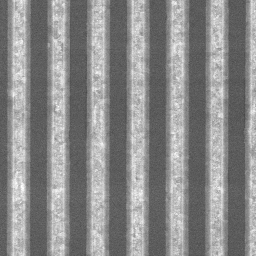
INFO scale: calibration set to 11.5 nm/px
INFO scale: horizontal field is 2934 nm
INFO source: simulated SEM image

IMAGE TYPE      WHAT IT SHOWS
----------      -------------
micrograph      parallel lines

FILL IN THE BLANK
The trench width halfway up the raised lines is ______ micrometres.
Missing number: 0.272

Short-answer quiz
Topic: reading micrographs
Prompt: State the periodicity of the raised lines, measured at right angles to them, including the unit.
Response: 454 nm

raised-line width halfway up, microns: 0.175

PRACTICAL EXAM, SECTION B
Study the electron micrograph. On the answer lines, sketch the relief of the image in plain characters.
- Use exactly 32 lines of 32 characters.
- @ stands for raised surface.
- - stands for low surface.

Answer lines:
--@---@@---@@---@@---@@---@@---@
--@---@@---@@---@@---@@---@@---@
-@@---@@---@@---@@---@@---@@---@
-@@---@@---@@---@@---@@---@@---@
-@@---@@---@@---@@---@@---@@---@
-@@---@@---@@---@@---@@---@@---@
-@@---@@---@@---@@---@@---@@---@
-@@---@@---@@---@@---@@---@@---@
-@@---@@---@@---@@---@@---@@---@
-@@---@@---@@---@@---@@---@@---@
-@@---@@---@@---@@---@@---@@---@
-@@---@@---@@---@@---@@---@@---@
-@@---@@---@@---@@---@@---@@---@
-@@---@@---@@---@@---@@---@@---@
-@@---@@---@@---@@---@@---@@---@
-@@---@@---@@---@@---@@---@@---@
-@@---@@---@@---@@---@@---@@---@
-@@---@@---@@---@@---@@---@@---@
-@@---@@---@@---@@---@@---@@---@
-@@---@@---@@---@@---@@---@@---@
-@@---@@---@@---@@---@@---@@---@
-@@---@@---@@---@@---@@---@@---@
-@@---@@---@@---@@---@@---@@---@
-@@---@@---@@---@@---@@---@@---@
-@@---@@---@@---@@---@@---@@---@
-@@---@@---@@---@@---@@---@@---@
-@@---@@---@@---@@---@@---@@---@
-@@---@@---@@---@@---@@---@@---@
-@@---@@---@@---@@---@@---@@---@
-@@---@@---@@---@@---@@---@@---@
-@@---@@---@@---@@---@@---@@---@
-@@---@@---@@---@@---@@---@@---@